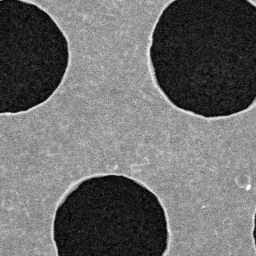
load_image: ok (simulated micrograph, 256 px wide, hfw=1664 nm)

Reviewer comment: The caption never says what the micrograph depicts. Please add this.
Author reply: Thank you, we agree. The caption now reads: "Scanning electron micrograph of holes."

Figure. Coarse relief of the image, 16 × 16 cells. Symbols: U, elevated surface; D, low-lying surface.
DDUUUUUUUUDDDDDD
DDDUUUUUUUDDDDDD
DDDDUUUUUDDDDDDD
DDDDUUUUUDDDDDDD
DDDDUUUUUUDDDDDD
DDDDUUUUUUDDDDDD
DDUUUUUUUUUDDDDD
UUUUUUUUUUUUUUUU
UUUUUUUUUUUUUUUU
UUUUUUUUUUUUUUUU
UUUUUUUUUUUUUUUU
UUUUUDDDDUUUUUUU
UUUUDDDDDDUUUUUU
UUUDDDDDDDUUUUUU
UUUDDDDDDDUUUUUU
UUUUDDDDDDUUUUUU